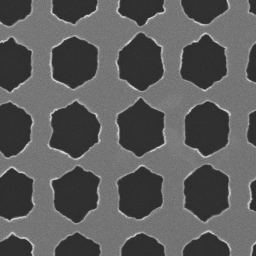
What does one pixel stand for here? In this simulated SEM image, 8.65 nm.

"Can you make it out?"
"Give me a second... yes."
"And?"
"a regular array of holes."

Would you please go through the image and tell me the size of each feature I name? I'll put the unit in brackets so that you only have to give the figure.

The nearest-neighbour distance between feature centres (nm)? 553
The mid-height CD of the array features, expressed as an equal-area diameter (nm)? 423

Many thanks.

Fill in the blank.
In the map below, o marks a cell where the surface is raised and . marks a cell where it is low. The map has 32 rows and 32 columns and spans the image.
....ooo.....ooo.....ooo.....ooo.
....ooo.....ooo.....ooo.....ooo.
...ooooo..ooooooo.oooooo...ooooo
oooooooooooooooooooooooooooooooo
ooooooooooooooooo.ooooooo.oooooo
..oooooo...ooooo....oooo...ooooo
....oo......ooo.....ooo.....ooo.
....oo......ooo.....ooo.....ooo.
....ooo.....ooo.....ooo.....ooo.
....ooo.....ooo.....ooo.....ooo.
...ooooo..oooooo...ooooo...ooooo
oooooooooooooooooooooooooooooooo
ooooooooooooooooo.oooooooooooooo
...ooooo...ooooo...ooooo...ooooo
....ooo.....ooo.....ooo......oo.
....oo......ooo.....ooo......oo.
....ooo.....ooo.....ooo......oo.
....oo......ooo.....ooo......oo.
...oooo....ooooo...ooooo....oooo
ooooooooo.ooooooo.oooooooooooooo
oooooooooooooooooooooooooooooooo
o.ooooooo..oooooo..ooooo....oooo
....ooo.....ooo.....ooo......ooo
....ooo.....ooo.....ooo......oo.
....ooo.....ooo.....ooo.....ooo.
....ooo.....ooo.....ooo......oo.
....ooo....oooo....ooooo....oooo
ooooooooo.ooooooooooooooo.oooooo
oooooooooooooooooooooooooooooooo
o.ooooooo.ooooooo..oooooo..ooooo
....ooo.....oooo....ooo.....oooo
....ooo......oo......oo......ooo